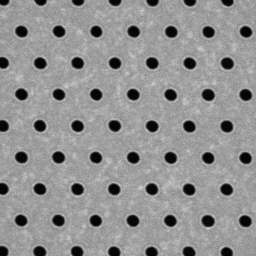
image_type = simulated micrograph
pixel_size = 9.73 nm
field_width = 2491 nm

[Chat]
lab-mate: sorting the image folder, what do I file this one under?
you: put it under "a regular array of holes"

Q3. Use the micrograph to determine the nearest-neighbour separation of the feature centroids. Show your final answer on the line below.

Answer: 355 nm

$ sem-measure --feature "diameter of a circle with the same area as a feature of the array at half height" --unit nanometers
121